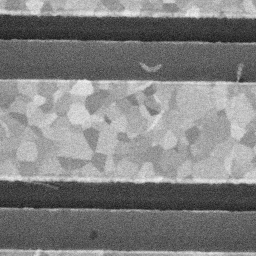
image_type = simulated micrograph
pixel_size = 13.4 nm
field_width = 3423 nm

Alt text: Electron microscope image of lines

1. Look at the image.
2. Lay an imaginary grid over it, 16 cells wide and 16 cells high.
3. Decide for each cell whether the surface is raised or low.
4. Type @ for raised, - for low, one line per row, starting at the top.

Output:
@@@@@@@@@@@@@@@@
----------------
----------------
----------------
----------------
@@@@@@@@@@@@@@@@
@@@@@@@@@@@@@@@@
@@@@@@@@@@@@@@@@
@@@@@@@@@@@@@@@@
@@@@@@@@@@@@@@@@
@@@@@@@@@@@@@@@@
----------------
----------------
----------------
----------------
----------------